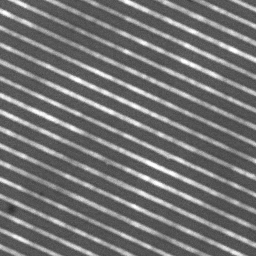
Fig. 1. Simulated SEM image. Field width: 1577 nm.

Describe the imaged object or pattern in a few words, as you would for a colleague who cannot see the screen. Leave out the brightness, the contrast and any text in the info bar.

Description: parallel lines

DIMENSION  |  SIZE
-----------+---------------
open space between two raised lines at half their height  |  0.0778 microns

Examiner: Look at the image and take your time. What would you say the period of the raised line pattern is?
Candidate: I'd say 94.3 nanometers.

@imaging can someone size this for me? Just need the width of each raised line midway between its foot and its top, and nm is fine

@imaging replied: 18.3